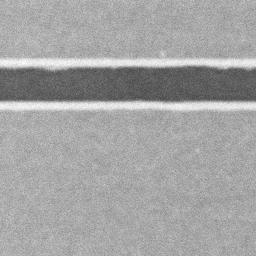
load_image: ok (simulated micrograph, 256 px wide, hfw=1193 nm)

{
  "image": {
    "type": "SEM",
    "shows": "one or a few lines or trenches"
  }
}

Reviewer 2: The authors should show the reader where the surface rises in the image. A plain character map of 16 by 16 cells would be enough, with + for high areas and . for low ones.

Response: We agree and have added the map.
++++++++++++++++
++++++++++++++++
++++++++++++++++
++++++++++++++++
................
................
................
++++++++++++++++
++++++++++++++++
++++++++++++++++
++++++++++++++++
++++++++++++++++
++++++++++++++++
++++++++++++++++
++++++++++++++++
++++++++++++++++